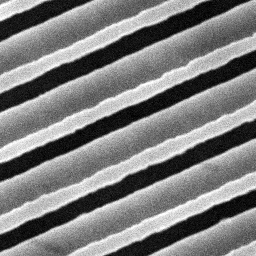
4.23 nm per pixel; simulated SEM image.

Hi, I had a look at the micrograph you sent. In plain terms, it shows lines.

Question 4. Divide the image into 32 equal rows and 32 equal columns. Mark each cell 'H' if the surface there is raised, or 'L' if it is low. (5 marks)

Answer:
HHHHHLLLLLLHHHHHHHHHHHHHHLLLLLHH
HHLLLLLLHHHHHHHHHHHHHHLLLLLLHHHH
LLLLLLHHHHHHHHHHHHHHLLLLLLHHHHHH
LLLLHHHHHHHHHHHHHHLLLLLLHHHHHHHH
LLHHHHHHHHHHHHHLLLLLLLHHHHHHHHHH
HHHHHHHHHHHHHHLLLLLHHHHHHHHHHHHH
HHHHHHHHHHHLLLLLLHHHHHHHHHHHHHHL
HHHHHHHHHLLLLLLHHHHHHHHHHHHHHLLL
HHHHHHHLLLLLLHHHHHHHHHHHHHHLLLLL
HHHHHLLLLLLHHHHHHHHHHHHHHLLLLLHH
HHLLLLLLHHHHHHHHHHHHHHLLLLLLHHHH
LLLLLLHHHHHHHHHHHHHHLLLLLHHHHHHH
LLLLHHHHHHHHHHHHHHLLLLLHHHHHHHHH
LHHHHHHHHHHHHHHLLLLLLHHHHHHHHHHH
HHHHHHHHHHHHHLLLLLLHHHHHHHHHHHHH
HHHHHHHHHHHLLLLLHHHHHHHHHHHHHHLL
HHHHHHHHHLLLLLHHHHHHHHHHHHHHLLLL
HHHHHHHLLLLLHHHHHHHHHHHHHHLLLLLL
HHHHLLLLLLHHHHHHHHHHHHHLLLLLLHHH
HHLLLLLLHHHHHHHHHHHHHHLLLLLHHHHH
LLLLLHHHHHHHHHHHHHHLLLLLLHHHHHHH
LLLHHHHHHHHHHHHHHLLLLLLHHHHHHHHH
LHHHHHHHHHHHHHHLLLLLHHHHHHHHHHHH
HHHHHHHHHHHHLLLLLLHHHHHHHHHHHHHH
HHHHHHHHHHLLLLLLHHHHHHHHHHHHHLLL
HHHHHHHHLLLLLLHHHHHHHHHHHHHLLLLL
HHHHHHLLLLLHHHHHHHHHHHHHHLLLLLLH
HHHLLLLLLHHHHHHHHHHHHHHLLLLLHHHH
HHLLLLLHHHHHHHHHHHHHHLLLLLHHHHHH
LLLLLHHHHHHHHHHHHHLLLLLLHHHHHHHH
LLHHHHHHHHHHHHHHLLLLLLHHHHHHHHHH
HHHHHHHHHHHHHHLLLLLLHHHHHHHHHHHH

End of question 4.